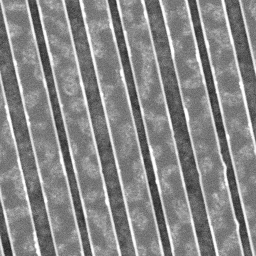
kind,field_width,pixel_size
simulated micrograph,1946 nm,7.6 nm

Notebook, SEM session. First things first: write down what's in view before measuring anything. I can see parallel lines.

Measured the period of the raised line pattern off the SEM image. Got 0.294 microns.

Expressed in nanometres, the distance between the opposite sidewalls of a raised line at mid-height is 201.